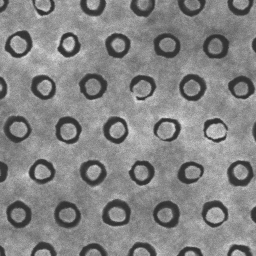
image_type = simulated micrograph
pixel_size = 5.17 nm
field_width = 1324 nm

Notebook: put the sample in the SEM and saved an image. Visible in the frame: a regular array of ring-shaped grooves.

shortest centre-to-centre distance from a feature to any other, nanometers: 244